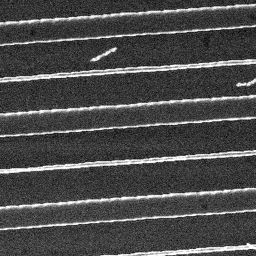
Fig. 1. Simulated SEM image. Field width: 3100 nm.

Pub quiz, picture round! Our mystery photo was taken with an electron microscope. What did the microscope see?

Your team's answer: lines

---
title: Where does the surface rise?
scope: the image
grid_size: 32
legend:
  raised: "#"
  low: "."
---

................................
....................############
......##########################
##############################..
###############.................
##..............................
................................
................................
.....................#..........
........##......................
................................
................................
.........................#######
............####################
################################
####################............
#######.........................
................................
................................
................................
................................
................................
................................
................................
....................############
......##########################
##############################..
################................
###.............................
................................
................................
................................